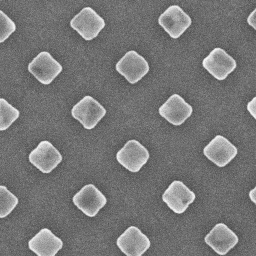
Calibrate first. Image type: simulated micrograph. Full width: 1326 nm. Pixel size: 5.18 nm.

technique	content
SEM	a regular array of raised bodies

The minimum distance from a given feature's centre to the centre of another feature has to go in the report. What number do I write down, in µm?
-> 0.318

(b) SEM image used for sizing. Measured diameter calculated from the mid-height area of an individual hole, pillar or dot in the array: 0.15 micrometres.